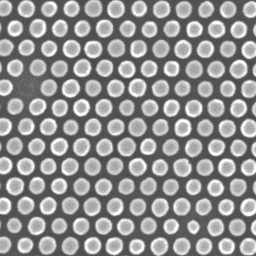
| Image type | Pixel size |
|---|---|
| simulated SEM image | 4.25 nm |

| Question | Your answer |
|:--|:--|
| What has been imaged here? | a regular array of raised bodies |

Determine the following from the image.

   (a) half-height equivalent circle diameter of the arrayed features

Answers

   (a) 16.3 px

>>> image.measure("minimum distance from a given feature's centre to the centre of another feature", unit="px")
21.9